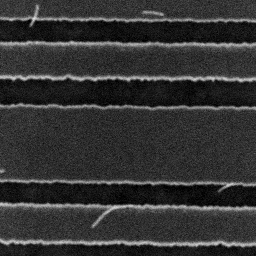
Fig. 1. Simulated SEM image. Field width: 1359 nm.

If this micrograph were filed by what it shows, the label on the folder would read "lines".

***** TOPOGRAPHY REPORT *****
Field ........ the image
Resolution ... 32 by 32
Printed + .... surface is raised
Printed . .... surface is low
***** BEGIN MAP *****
++++++++++++++++++++++++++++++++
++++++++++++++++++++++++++++++++
....+.....+..+++++++++++++++++++
................................
................................
+++++++++++++++++++++++++++++.++
++++++++++++++++++++++++++++++++
++++++++++++++++++++++++++++++++
++++++++++++++++++++++++++++++++
++++++++++++++++++++++++++++++++
................................
................................
................................
++++++++++++++++++++++++++++++++
++++++++++++++++++++++++++++++++
++++++++++++++++++++++++++++++++
++++++++++++++++++++++++++++++++
++++++++++++++++++++++++++++++++
++++++++++++++++++++++++++++++++
++++++++++++++++++++++++++++++++
++++++++++++++++++++++++++++++++
++++++++++++++++++++++++++++++++
++++++++++++++++++++++++++++++++
................................
................................
+.++............................
++++++++++++++++++++++++++++++++
++++++++++++++++++++++++++++++++
++++++++++++++++++++++++++++++++
++++++++++++++++++++++++++++++++
...........+.+..++.++++++++.++++
................................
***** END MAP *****